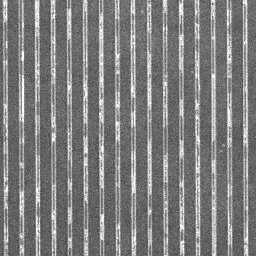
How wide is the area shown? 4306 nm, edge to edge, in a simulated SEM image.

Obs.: parallel lines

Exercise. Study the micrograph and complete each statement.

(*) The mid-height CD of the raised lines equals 58.9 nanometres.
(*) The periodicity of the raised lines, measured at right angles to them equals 0.269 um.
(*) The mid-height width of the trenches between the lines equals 206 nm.